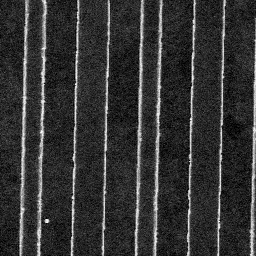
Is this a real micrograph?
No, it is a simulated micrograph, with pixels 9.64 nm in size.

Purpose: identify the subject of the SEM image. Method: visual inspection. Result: lines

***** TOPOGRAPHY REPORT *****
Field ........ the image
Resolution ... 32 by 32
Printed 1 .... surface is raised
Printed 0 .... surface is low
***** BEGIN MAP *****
00011100001111000011000011110000
00011100001111000011000011110000
00011100001111000011000011110000
00011100001111000011000011110000
00011100001111000011000011110000
00011100001111000011000011110000
00011000001110000011000011110000
00011100001110000011000011110000
00011000001110000011000011110000
00011000001110000011000011110000
00011000011110000011000011110000
00011000011110000011000011110000
00011000011110000011000011110000
00011000011110000011000011110000
00011000011110000111000011110000
00011000011110000111000011110000
00011000011110000111000011110000
00011000011110000111000011110000
00011000011110000111000011110000
00011000011110000111000011110000
00011000011110000111000011110000
00011000011110000111000011110000
00011000011110000111000011110000
00011000011110000111000011110000
00011000011110000111000011110000
00011000011110000110000011100000
00011000011110000110000011100000
00011000011110000110000011100000
00011000011110000110000011100000
00011000011110000110000111100000
00011000011110000110000111100000
00011000011110000110000111100001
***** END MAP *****